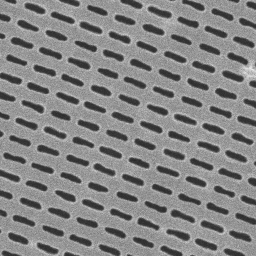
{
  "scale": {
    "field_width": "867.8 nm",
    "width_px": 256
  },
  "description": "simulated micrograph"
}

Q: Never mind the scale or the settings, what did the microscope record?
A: a regular array of holes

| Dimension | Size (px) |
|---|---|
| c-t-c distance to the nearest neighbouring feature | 18.4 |